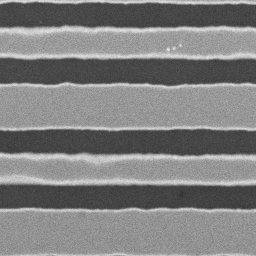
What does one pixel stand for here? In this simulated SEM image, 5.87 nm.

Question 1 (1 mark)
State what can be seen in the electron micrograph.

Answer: lines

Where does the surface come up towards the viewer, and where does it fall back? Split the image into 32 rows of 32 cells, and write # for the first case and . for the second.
................................
................................
................................
################################
################################
################################
################################
................................
................................
................................
.###...###....###..........#####
################################
################################
################################
################################
################################
................................
................................
................................
#######################..#######
################################
################################
################################
................................
................................
................................
################################
################################
################################
################################
################################
################################